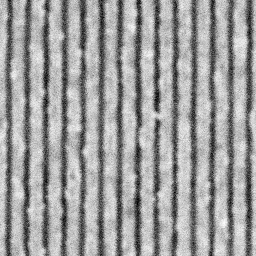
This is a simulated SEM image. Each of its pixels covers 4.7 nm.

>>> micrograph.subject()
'parallel lines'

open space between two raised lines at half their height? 31.1 nm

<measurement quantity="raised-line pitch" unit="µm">0.0868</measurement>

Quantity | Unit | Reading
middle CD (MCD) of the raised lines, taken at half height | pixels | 11.4